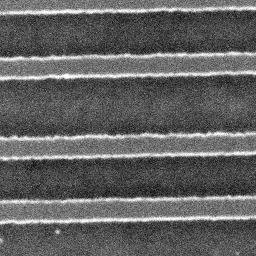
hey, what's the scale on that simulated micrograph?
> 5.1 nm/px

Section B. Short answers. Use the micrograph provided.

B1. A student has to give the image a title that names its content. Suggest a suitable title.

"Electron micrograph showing lines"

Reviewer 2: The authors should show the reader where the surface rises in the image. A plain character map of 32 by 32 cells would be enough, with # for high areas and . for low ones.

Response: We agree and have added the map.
################################
##########.#....................
................................
................................
................................
................................
................................
################################
################################
###############.................
................................
................................
................................
................................
................................
................................
................................
################################
################################
#################...............
................................
................................
................................
................................
................................
################################
################################
###################.............
................................
................................
................................
................................